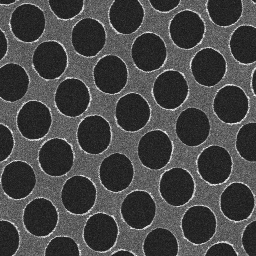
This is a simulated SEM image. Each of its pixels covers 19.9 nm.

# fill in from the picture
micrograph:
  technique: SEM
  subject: a regular array of holes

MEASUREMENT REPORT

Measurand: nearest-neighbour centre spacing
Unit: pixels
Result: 43.4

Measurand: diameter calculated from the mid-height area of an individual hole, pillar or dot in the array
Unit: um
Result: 0.722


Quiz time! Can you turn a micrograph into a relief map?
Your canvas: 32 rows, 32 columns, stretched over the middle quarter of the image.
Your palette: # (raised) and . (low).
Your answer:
.#######.......###......########
#######.........###....#########
#######.........########.....###
########........#######.......##
.....###........#######........#
.....###.......#######.........#
......###.....########.........#
......##########..####.........#
.......#######......###.......##
......#######........##.......##
......#######........###.....###
.....########........#########..
....#########.........#######...
#####.....###........#######....
####.......##........#######....
####.......###......########....
###.........###....####.####....
###.........########......##....
###.........#######.......###...
.###........#######........##...
..##.......########........####.
..###.....########.........#####
..#####.####..#####........#####
..########......###........#####
..########.......##.......######
..#######........###.....#######
.########........#########....##
#########........########......#
##....###........#######........
.......##........#######........
........##......########........
........###....#########........